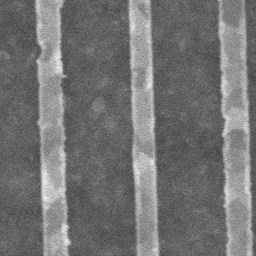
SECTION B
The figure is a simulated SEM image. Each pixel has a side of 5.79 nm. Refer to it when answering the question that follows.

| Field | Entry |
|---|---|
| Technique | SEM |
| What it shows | one or a few lines or trenches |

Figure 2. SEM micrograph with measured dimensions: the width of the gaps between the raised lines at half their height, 409 nm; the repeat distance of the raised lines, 531 nanometers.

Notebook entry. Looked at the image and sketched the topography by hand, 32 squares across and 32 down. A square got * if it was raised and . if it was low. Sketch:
.....***........***........***..
.....**.........***.........**..
.....**.........***.........***.
.....**.........***.........***.
.....***........***........****.
.....**.........***.........***.
.....**.........***.........***.
.....**.........***.........***.
.....***........***.........***.
.....***.........**.........***.
.....**..........**.........***.
.....***.........**.........***.
.....***.........**.........***.
.....***.........**.........***.
.....***.........**.........***.
.....***.........**.........***.
.....***.........**.........***.
.....***.........**.........***.
.....***.........**.........***.
.....***.........**.........***.
.....***.........**.........***.
.....***.........**.........***.
.....***.........**.........***.
.....***.........**.........***.
.....***.........**.........***.
.....***.........**.........***.
.....***.........**.........***.
......**.........***........***.
......**.........***.........**.
......**.........***.........**.
......***........***........***.
......**.........***........***.